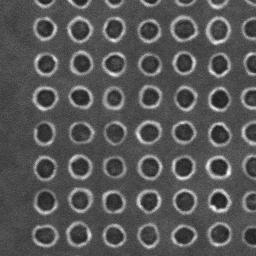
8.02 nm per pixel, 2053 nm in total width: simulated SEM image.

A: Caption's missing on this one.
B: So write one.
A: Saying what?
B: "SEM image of a regular array of holes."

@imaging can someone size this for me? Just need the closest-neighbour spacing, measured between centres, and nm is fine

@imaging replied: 270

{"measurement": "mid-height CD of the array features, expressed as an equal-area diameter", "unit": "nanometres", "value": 152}